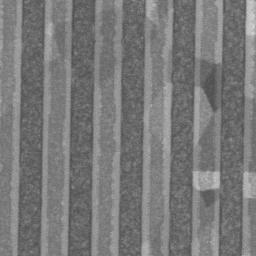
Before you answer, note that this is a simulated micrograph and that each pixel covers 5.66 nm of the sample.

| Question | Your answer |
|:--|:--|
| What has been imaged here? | parallel lines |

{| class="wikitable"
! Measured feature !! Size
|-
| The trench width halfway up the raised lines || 28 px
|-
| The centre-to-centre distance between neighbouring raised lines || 284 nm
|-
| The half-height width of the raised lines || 124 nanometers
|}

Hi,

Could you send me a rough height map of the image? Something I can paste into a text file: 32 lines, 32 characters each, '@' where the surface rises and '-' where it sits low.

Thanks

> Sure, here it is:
@@----@@@---@@@----@@----@@@---@
@@----@@@---@@@----@@----@@@---@
@@----@@@---@@@----@@----@@----@
@@----@@@---@@@---@@@----@@----@
@@----@@@---@@@---@@@----@@----@
@@----@@@---@@@---@@@----@@----@
@@----@@@---@@@---@@@----@@----@
@@----@@@---@@@---@@@----@@----@
@@----@@@---@@@---@@@----@@----@
@@----@@@---@@@---@@@----@@----@
@@----@@@---@@@---@@@----@@----@
@@----@@----@@@---@@@----@@----@
@@----@@----@@@---@@@----@@----@
@@----@@----@@@---@@@----@@----@
@@----@@----@@@---@@@----@@----@
@@----@@----@@@---@@@----@@----@
@@----@@----@@@---@@@----@@----@
@@----@@----@@@---@@@----@@----@
@@----@@----@@@---@@@----@@----@
@@----@@----@@@---@@@----@@----@
@@----@@----@@@---@@@----@@----@
@@----@@----@@@---@@@----@@----@
@@----@@----@@@---@@@----@@----@
@@----@@----@@@---@@@---@@@----@
@@----@@----@@@---@@@---@@@----@
@@----@@----@@----@@@---@@@----@
@@----@@----@@----@@@---@@@----@
@@----@@----@@----@@@---@@@----@
@@----@@----@@----@@@---@@@----@
@@----@@----@@----@@@---@@@----@
@@----@@----@@----@@@---@@@----@
@@----@@----@@----@@@---@@@----@